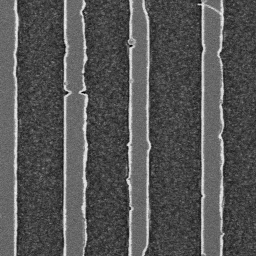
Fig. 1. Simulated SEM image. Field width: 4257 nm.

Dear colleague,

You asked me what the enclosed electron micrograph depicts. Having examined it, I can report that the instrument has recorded one or a few lines or trenches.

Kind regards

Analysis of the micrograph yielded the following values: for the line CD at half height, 316 nanometers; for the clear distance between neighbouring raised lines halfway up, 49.1 px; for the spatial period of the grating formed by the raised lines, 1140 nm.